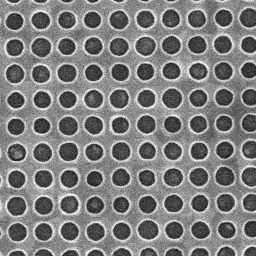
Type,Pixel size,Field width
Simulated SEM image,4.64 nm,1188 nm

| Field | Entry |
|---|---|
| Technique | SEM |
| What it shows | a regular array of holes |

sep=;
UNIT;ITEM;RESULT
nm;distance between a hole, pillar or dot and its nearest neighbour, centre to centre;119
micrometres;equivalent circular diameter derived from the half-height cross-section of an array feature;0.0839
